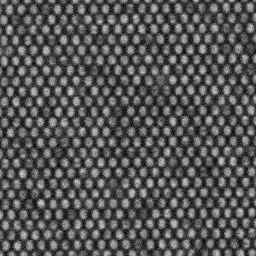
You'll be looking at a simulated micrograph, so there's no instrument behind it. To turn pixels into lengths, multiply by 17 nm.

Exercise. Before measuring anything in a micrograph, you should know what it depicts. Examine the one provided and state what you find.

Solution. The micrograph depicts a regular array of raised bodies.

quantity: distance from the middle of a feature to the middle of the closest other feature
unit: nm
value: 195